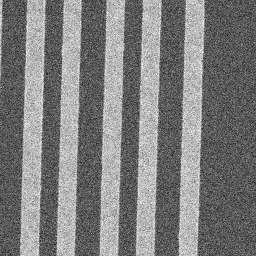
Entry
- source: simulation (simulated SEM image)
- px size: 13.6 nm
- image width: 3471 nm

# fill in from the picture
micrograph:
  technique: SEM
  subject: parallel lines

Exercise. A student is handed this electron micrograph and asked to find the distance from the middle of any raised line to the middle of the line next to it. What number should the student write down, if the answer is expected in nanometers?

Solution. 538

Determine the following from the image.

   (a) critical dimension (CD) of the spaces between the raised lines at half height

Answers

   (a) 341 nm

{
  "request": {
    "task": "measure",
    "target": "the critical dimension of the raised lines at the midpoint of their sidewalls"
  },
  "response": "241 nanometres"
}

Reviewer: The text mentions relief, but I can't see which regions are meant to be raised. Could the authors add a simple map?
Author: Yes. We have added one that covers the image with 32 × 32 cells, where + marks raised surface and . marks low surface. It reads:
....++..++...+++..++...++.......
...+++..++...++...++...++.......
...+++..++...++...++...++.......
...++...++...++...++...++.......
...++...++...++...++...++.......
...++...++...++...++...++.......
...++...++...++...++...++.......
...++...++...++...++...++.......
...++...++...++...++...++.......
...++...++...++...++...++.......
...++...++...++...++...++.......
...++...++...++...++...++.......
...++...++...++...++...++.......
...++...++...++...++...++.......
...++...++...++...++...++.......
...++...++...++...++...++.......
...++...++...++...++...++.......
...++...++...++..+++...++.......
...++...++...++..+++...++.......
...++...++...++..+++...++.......
...++..+++...++..+++...++.......
...++..+++...++..++....++.......
...++..++....++..++....++.......
...++..++....++..++....++.......
...++..++....++..++....++.......
...++..++....++..++....++.......
...++..++....++..++....++.......
...++..++....++..++....++.......
...++..++....++..++....++.......
...++..++....++..++...+++.......
...++..++....++..++...+++.......
...++..++....++..++...+++.......